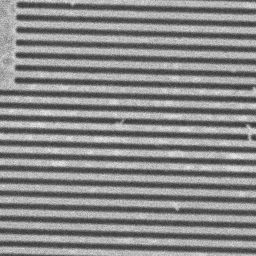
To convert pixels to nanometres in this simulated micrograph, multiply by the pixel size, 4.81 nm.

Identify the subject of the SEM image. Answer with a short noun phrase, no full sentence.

parallel lines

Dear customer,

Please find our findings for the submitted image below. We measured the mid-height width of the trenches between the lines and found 0.0325 um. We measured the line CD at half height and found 28.3 nanometres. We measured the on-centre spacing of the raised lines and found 60.5 nm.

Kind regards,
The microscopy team